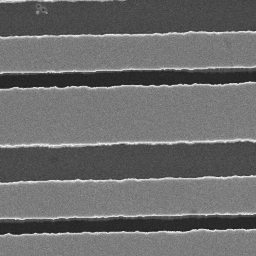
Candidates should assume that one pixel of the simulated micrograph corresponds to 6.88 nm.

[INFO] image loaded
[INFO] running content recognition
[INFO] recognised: lines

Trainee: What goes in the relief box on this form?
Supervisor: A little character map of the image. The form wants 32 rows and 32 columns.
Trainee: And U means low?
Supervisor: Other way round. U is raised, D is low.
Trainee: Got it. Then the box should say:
DDDDDDDDDDDDDDDDDDDDDDDDDDDDDDDD
DDDDDDDDDDDDDDDDDDDDDDDDDDDDDDDD
DDDDDDDDDDDDDDDDDDDDDDDDDDDDDDDD
DDDDDDDDDDDDDDDDDDDDDDDDDDDDDDDD
DDDDDUDUUUUUUUUUUUUUUUUUUUUUUUUU
UUUUUUUUUUUUUUUUUUUUUUUUUUUUUUUU
UUUUUUUUUUUUUUUUUUUUUUUUUUUUUUUU
UUUUUUUUUUUUUUUUUUUUUUUUUUUUUUUU
UUUUUUUUUUUUUUUUUUUUUUUUUUUUUUUU
DDDDDDDDDDDDDDDDDDDDDDDDDDDDDDDD
DDDDDDDDDDDDDDDDDDDDDDDDUUDDUUUU
UUUUUUUUUUUUUUUUUUUUUUUUUUUUUUUU
UUUUUUUUUUUUUUUUUUUUUUUUUUUUUUUU
UUUUUUUUUUUUUUUUUUUUUUUUUUUUUUUU
UUUUUUUUUUUUUUUUUUUUUUUUUUUUUUUU
UUUUUUUUUUUUUUUUUUUUUUUUUUUUUUUU
UUUUUUUUUUUUUUUUUUUUUUUUUUUUUUUU
UUUUUUUUUUUUUUUUUUUUUUUUUUUUUUUU
DDDDDDDDDDDDDDDDDDDDDDDDDDDDDDDD
DDDDDDDDDDDDDDDDDDDDDDDDDDDDDDDD
DDDDDDDDDDDDDDDDDDDDDDDDDDDDDDDD
DDDDDDDDDDDDDDDDDDDDDDDDDDDDDDDD
DDDDDDDDDDDDDDDUUUUUUUUUUUUUUUUU
UUUUUUUUUUUUUUUUUUUUUUUUUUUUUUUU
UUUUUUUUUUUUUUUUUUUUUUUUUUUUUUUU
UUUUUUUUUUUUUUUUUUUUUUUUUUUUUUUU
UUUUUUUUUUUUUUUUUUUUUUUUUUUUUUUU
DDDDDDDDDDDDDDDDDDDDDDDDDDDDDDDD
DDDDDDDDDDDDDDDDDDDDDDDDDDDDDDDD
UUUUUUUUUUUUUUUUUUUUUUUUUUUUUUUU
UUUUUUUUUUUUUUUUUUUUUUUUUUUUUUUU
UUUUUUUUUUUUUUUUUUUUUUUUUUUUUUUU